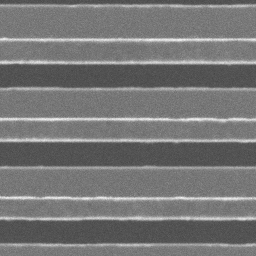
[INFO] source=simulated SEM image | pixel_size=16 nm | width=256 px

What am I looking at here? lines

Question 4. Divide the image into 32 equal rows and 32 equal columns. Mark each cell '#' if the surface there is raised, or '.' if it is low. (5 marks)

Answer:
................................
################################
################################
################################
################################
################################
################################
################################
................................
................................
................................
################################
################################
################################
################################
################################
################################
################################
................................
................................
................................
################################
################################
################################
################################
################################
################################
................................
................................
................................
................................
################################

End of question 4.